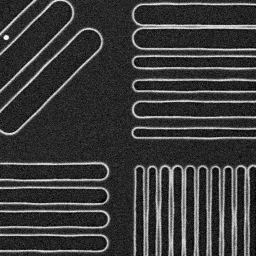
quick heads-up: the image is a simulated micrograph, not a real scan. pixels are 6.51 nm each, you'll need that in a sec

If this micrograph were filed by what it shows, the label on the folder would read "groups of lines, slits or small figures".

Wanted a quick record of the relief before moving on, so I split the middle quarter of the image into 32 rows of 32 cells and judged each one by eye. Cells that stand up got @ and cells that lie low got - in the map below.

----@@@@@@@@@@@@@@--------------
---@@@@@@@@@@@@@@@@@@@@@@@@@@@@@
--@@@@@@@@@@@@@@@@@@@@@@@@@@@@@@
--@@@@@@@@@@@@@@@@@@@@@@@@@@@@@@
-@@@@@@@@@@@@@@@@@--------------
@@@@@@@@@@@@@@@@@---------------
@@@@@@@@@@@@@@@@@@--------------
@@@@@@@@@@@@@@@@@@@@@@@@@@@@@@@@
@@@@@@@@@@@@@@@@@@@@@@@@@@@@@@@@
@@@@@@@@@@@@@@@@@@@-------------
@@@@@@@@@@@@@@@@@@--------------
@@@@@@@@@@@@@@@@@---------------
@@@@@@@@@@@@@@@@@@--------------
@@@@@@@@@@@@@@@@@@@@@@@@@@@@@@@@
@@@@@@@@@@@@@@@@@@@@@@@@@@@@@@@@
@@@@@@@@@@@@@@@@@@@@@@@@@@@@@@@@
@@@@@@@@@@@@@@@@@@--------------
@@@@@@@@@@@@@@@@@---------------
@@@@@@@@@@@@@@@@@@@@@@@@@@@@@@@@
@@@@@@@@@@@@@@@@@@@@@@@@@@@@@@@@
@@@@@@@@@@@@@@@@@@@@@@@@@@@@@@@@
@@@@@@@@@@@@@@@@@@@@@@@@@@@@@@@@
@@@@@@@@@@@@@@@@@@@@@@@@@@@@@@@@
@@@@@@@@@@@@@@@@@@@@@@@@@@@@@@@@
@@@@@@@@@@@@@@@@@@@@@@@@@@@@@@@@
----------@@@@@@@@@@@@@@@@@@@@@@
-----------@@@@@@@--@--@--@--@--
-----------@@@@@@@--@--@--------
----------@@@@@@@@--@--@--------
@@@@@@@@@@@@@@@@@@--@--@--------
@@@@@@@@@@@@@@@@@@--@--@--------
----------@@@@@@@@--@--@--@-----